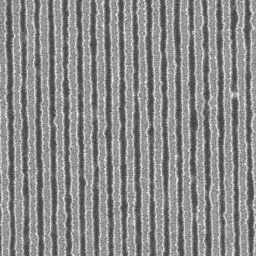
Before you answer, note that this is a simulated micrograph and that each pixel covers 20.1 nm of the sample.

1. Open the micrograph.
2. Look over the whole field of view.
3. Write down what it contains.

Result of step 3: parallel lines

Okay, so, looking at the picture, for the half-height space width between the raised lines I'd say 0.121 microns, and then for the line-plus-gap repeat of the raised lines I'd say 282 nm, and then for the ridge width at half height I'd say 0.161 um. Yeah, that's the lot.